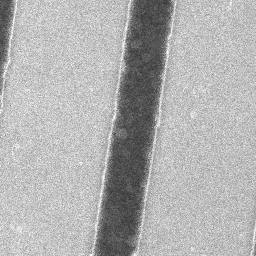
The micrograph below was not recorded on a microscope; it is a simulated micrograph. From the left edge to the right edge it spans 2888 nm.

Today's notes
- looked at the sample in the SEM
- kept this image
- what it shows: one or a few lines or trenches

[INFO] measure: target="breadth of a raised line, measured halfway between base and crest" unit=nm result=517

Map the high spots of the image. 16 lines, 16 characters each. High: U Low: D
UDDDDDDDUUUDDDDD
UDDDDDDDUUUDDDDD
UDDDDDDDUUUDDDDD
UDDDDDDDUUDDDDDD
DDDDDDDDUUDDDDDD
DDDDDDDUUUDDDDDD
DDDDDDDUUUDDDDDD
DDDDDDDUUUDDDDDD
DDDDDDDUUUDDDDDD
DDDDDDDUUUDDDDDD
DDDDDDDUUDDDDDDD
DDDDDDUUUDDDDDDD
DDDDDDUUUDDDDDDD
DDDDDDUUUDDDDDDD
DDDDDDUUUDDDDDDD
DDDDDDUUUDDDDDDD